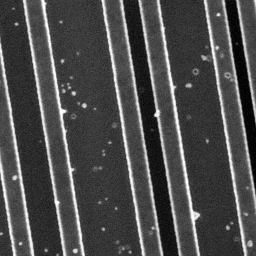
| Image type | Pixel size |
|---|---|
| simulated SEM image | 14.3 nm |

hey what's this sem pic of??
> lines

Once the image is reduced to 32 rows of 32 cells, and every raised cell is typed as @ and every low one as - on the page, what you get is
---@@--------@@--@@@------@@--@@
---@@@-------@@@--@@------@@--@@
---@@@-------@@@--@@------@@--@@
---@@@-------@@@--@@------@@@-@@
----@@-------@@@--@@@-----@@@-@@
----@@--------@@--@@@-----@@@-@@
----@@--------@@--@@@------@@--@
----@@@-------@@---@@------@@--@
@---@@@-------@@@--@@------@@--@
@---@@@-------@@@--@@------@@@-@
@----@@-------@@@--@@@-----@@@-@
@----@@--------@@--@@@-----@@@-@
@----@@--------@@--@@@------@@-@
@----@@@-------@@--@@@------@@--
@@---@@@-------@@@-@@@------@@--
@@---@@@-------@@@--@@------@@@-
@@----@@-------@@@--@@------@@@-
@@----@@--------@@--@@@-----@@@-
@@----@@--------@@--@@@-----@@@-
@@----@@@-------@@--@@@------@@-
@@----@@@-------@@@--@@------@@-
@@@---@@@-------@@@--@@------@@-
@@@----@@-------@@@--@@------@@@
@@@----@@-------@@@--@@@-----@@@
-@@----@@--------@@--@@@-----@@@
-@@----@@@-------@@--@@@------@@
-@@----@@@-------@@---@@------@@
-@@@---@@@-------@@@--@@------@@
-@@@---@@@-------@@@--@@------@@
-@@@----@@-------@@@--@@@-----@@
--@@----@@--------@@--@@@-----@@
--@@----@@--------@@--@@@------@